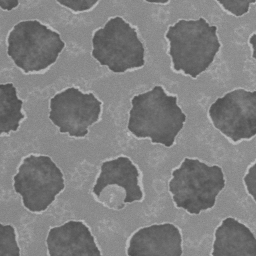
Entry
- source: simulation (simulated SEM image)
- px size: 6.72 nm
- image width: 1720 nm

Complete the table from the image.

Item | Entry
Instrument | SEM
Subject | a regular array of holes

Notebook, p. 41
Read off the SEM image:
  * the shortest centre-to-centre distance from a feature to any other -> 506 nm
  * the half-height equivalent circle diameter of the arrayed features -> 354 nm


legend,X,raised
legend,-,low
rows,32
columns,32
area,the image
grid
--XXXXXX----XXXXXXXXXXXXXXX----X
XXXXXXXXX-XXXXXXXXXXXXXXXXXX---X
XXXXXXXXXXXXXX-XXXXXXXXX--XXXXXX
XX----XXXXXXX----XXXX------XXXXX
X------XXXXX-----XXXX------XXXX-
X-------XXXX------XXX------XXXX-
X-------XXXX------XXX------XXXX-
XX-----XXXXX------XXX------XXXXX
XX----XXXXXXXX---XXXXX----XXXXXX
XXXXXXXXXXXXXXXXXXXXXXXX-XXXXXXX
XXXXXXXXXXXXXXXXXXXXXXXXXXXXXXXX
--XXXXX---XXXXXXXX---XXXXXXXX---
---XXX------XXXXX-----XXXXX-----
---XXX-------XXX------XXXX------
---XXX------XXXX-------XXX------
--XXXXX-----XXXX-------XXXX-----
-XXXXXXX---XXXXX------XXXXXX----
XXXXXXXXXXXXXXXXXXX---XXXXXXX-XX
XXXXXXXXXXXXXXXXXXXXXXXXXXXXXXXX
XXXX-XXXXXXXXXXXXXXXXXXXXXXXXXXX
XXX----XXXXXX----XXXXXX---XXXXXX
XX------XXXXX----XXXXX------XXX-
XX------XXXX------XXX-------XX--
XX------XXXX------XXX-------XXX-
XXX----XXXXX-XX---XXXX-----XXXX-
XXX---XXXXXXXXX-XXXXXX-----XXXXX
XXXX-XXXXXXXXXXXXXXXXXXX-XXXXXXX
XXXXXXXXXXXXXXXXXXXXXXXXXXXX-XXX
--XXXXX----XXXXXXX----XXXXX----X
--XXXX------XXXX-------XXXX-----
--XXXX------XXXX-------XXXX-----
--XXXX------XXXX-------XXX------